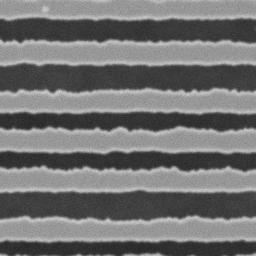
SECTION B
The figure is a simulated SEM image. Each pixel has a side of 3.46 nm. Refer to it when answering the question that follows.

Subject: lines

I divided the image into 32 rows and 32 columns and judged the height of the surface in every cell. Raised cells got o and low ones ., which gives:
oooooooooooooooooooooooooooooooo
oooooooooooooooooooooooooooooooo
................................
................................
................................
oooooooooooooooooooooooooooooooo
oooooooooooooooooooooooooooooooo
oooooooooooooooooooooooooooooooo
................................
................................
................................
o.oooo.o...oooooooooooo.oooooooo
oooooooooooooooooooooooooooooooo
oooooooooooooooooooooooooooooooo
................................
................................
oooooooooooooooooooooooooooooooo
oooooooooooooooooooooooooooooooo
oooooooooooooooooooooooooooooooo
................................
................................
oooooooooooooooooooooooooooooooo
oooooooooooooooooooooooooooooooo
oooooooooooooooooooooooooooooooo
................................
................................
................................
ooooooooo.oo.o.....ooooooooooooo
oooooooooooooooooooooooooooooooo
oooooooooooooooooooooooooooooooo
................................
................................